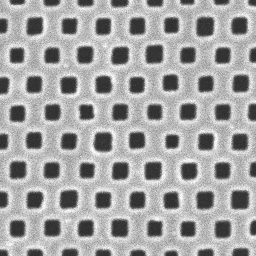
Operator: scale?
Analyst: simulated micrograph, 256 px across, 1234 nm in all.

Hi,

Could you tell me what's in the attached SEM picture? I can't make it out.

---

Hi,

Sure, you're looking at a regular array of holes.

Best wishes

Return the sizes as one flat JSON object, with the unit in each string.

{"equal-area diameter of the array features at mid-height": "17.3 pixels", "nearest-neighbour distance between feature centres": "0.159 um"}